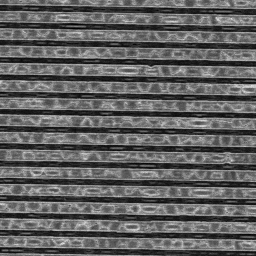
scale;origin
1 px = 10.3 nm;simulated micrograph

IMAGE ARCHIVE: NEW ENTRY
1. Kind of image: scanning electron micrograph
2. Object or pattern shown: parallel lines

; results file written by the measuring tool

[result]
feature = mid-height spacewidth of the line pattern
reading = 71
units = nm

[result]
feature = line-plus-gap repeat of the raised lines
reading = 179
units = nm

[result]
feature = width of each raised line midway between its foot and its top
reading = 107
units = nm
